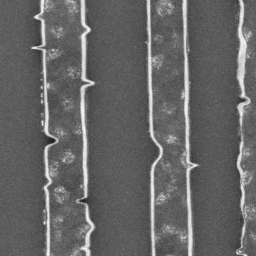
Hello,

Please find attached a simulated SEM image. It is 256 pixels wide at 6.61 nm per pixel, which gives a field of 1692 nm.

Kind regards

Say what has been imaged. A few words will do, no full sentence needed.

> one or a few lines or trenches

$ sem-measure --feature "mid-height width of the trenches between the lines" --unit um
0.397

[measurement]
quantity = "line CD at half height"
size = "0.246 microns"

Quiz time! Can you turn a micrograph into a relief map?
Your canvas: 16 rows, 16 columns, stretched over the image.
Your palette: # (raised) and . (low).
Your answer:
...##....###...#
...##....###...#
...##....###...#
...##....###...#
...##....###...#
...##....###...#
...##....###...#
...##....###...#
...##.....##...#
...##.....##...#
...##.....##...#
...##.....##...#
...##.....##...#
...##.....##...#
...###....##...#
...##.....##...#